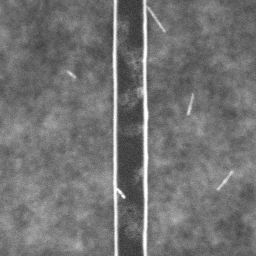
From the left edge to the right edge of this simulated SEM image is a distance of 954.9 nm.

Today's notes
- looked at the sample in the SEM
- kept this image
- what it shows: one or a few lines or trenches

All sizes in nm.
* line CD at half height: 117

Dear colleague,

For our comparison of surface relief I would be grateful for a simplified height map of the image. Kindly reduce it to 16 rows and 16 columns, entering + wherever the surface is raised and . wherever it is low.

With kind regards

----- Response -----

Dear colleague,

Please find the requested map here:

.......++.......
.......++.......
.......++.......
.......++.......
.......++.......
.......++.......
.......++.......
.......++.......
.......++.......
.......++.......
.......++.......
.......++.......
.......++.......
.......++.......
.......++.......
.......++.......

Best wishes